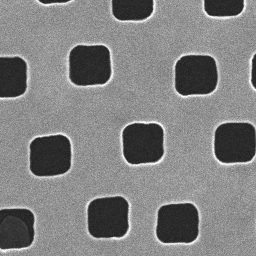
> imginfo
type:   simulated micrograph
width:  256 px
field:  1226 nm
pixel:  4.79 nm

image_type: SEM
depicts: holes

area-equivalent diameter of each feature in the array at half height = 211 nm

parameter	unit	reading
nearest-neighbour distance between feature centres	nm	400